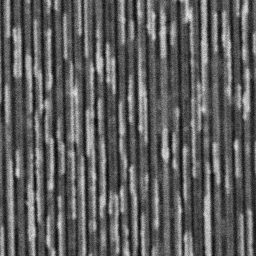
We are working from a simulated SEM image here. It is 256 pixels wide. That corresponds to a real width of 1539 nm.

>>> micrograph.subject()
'parallel lines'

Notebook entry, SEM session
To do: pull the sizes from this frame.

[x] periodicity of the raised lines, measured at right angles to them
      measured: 62.3 nm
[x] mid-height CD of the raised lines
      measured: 35.3 nanometers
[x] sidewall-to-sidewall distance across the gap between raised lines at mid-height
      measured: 30.1 nm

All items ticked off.